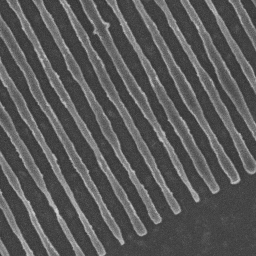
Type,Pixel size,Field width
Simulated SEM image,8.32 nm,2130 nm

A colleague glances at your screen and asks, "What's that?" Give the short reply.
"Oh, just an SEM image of parallel lines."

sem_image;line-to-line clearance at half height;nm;113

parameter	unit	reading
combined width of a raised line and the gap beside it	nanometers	179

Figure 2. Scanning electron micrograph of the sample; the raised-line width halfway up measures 66.4 nanometers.